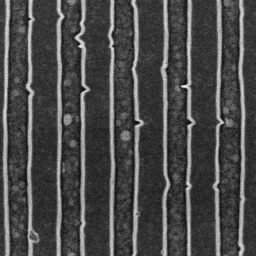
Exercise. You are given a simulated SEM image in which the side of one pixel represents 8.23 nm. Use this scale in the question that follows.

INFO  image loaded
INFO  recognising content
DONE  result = parallel lines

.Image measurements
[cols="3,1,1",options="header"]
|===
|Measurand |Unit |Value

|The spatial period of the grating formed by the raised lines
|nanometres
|436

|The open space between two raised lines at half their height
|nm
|189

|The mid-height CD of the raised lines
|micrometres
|0.247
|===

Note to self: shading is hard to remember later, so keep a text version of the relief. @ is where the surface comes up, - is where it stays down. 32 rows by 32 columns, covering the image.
@---@@@---@@@@---@@@@---@@@---@@
@---@@@---@@@@---@@@@---@@@---@@
@---@@@@--@@@@---@@@@---@@@---@@
@---@@@---@@@@---@@@@---@@@---@@
@---@@@---@@@@---@@@@---@@@---@@
@---@@@---@@@@---@@@@---@@@---@@
@---@@@----@@@---@@@@---@@@---@@
@---@@@---@@@@---@@@@---@@@---@@
@---@@@---@@@@---@@@----@@@---@@
@---@@@---@@@@---@@@@---@@@---@@
@---@@@---@@@@---@@@@---@@@---@@
@---@@@----@@@---@@@@---@@@---@@
@---@@@---@@@@---@@@@---@@@---@@
@---@@@---@@@@---@@@@---@@@---@@
@---@@@---@@@@---@@@@---@@@---@@
@---@@@---@@@@---@@@@---@@@@--@@
@---@@@---@@@@---@@@@---@@@---@@
@---@@@---@@@@---@@@@---@@@---@@
@---@@@---@@@@---@@@@---@@@---@@
@---@@@---@@@@---@@@@---@@@---@@
@---@@@---@@@@---@@@@---@@@---@@
@---@@@---@@@@---@@@@---@@@---@@
@---@@@---@@@@---@@@@---@@@---@@
@---@@@---@@@@---@@@@---@@@---@@
@---@@@---@@@@---@@@@---@@@---@@
@---@@@---@@@@---@@@@---@@@---@@
@---@@@---@@@@---@@@@---@@@---@@
@---@@@---@@@@---@@@@---@@@---@@
@---@@@---@@@@---@@@@---@@@---@@
@---@@@---@@@@---@@@@---@@@---@@
@---@@@---@@@@---@@@@---@@@---@@
@---@@@---@@@@---@@@@---@@@---@@